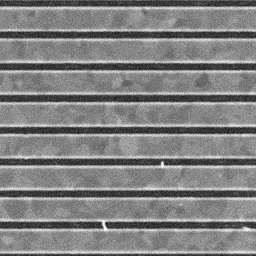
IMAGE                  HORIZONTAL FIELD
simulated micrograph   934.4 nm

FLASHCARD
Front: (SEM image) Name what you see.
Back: parallel lines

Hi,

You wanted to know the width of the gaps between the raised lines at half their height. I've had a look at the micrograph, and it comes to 30.6 nanometres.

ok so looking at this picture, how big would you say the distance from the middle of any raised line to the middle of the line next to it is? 116 nanometers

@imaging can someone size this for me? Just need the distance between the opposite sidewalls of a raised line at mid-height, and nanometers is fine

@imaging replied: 83.1